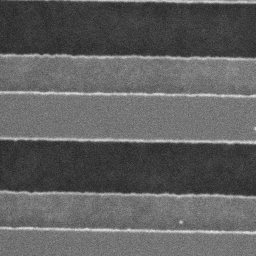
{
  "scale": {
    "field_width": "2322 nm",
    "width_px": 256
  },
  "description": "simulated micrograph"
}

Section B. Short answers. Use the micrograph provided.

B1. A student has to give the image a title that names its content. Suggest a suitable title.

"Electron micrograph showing lines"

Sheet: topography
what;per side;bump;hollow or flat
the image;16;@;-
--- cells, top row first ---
----------------
----------------
----------------
@@@@------------
@@@@@@@@@@@@@@@@
@@@@@@@@@@@@@@@@
@@@@@@@@@@@@@@@@
@@@@@@@@@@@@@@@@
@@@@@@@@@@@@@@@@
----------------
----------------
----------------
@@@@@@@@@@@@@@@@
@@@@@@@@@@@@@@@@
@@@@@@@@@@@@@@@@
@@@@@@@@@@@@@@@@